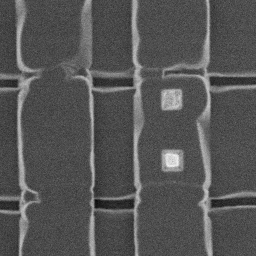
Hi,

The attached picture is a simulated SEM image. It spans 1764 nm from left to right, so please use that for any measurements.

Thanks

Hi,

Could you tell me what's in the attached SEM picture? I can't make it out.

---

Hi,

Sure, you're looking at wiring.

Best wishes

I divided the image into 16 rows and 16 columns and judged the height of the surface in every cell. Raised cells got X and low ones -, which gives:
-XXXX---XXXXX---
-XXXX---XXXXX---
-XXXX---XXXXX---
-XXXX---XXXXX---
--XXX----XXX----
--XXXX---XXXX---
-XXXXX---X-XX---
-XXXXX---XXXX---
-XXXXX--XXXXX---
-XXXXX--XXXXX---
-XXXXX--XXXXX---
-XXXXX---XXXX---
-XXXXX---XXXX---
-XXXXX--XXXXX---
-XXXXX--XXXXX---
-XXXXX--XXXXX---